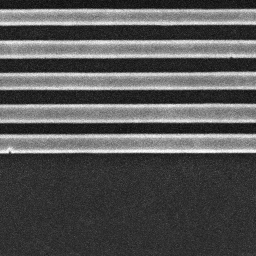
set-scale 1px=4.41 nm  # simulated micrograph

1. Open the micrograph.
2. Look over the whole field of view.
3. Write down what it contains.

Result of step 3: parallel lines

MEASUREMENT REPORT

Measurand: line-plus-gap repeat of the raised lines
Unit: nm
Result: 140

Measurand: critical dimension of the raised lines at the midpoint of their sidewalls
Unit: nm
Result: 65.7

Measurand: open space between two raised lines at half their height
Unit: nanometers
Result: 73.9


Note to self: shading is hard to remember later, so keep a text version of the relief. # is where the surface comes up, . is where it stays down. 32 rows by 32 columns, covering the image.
................................
################################
################################
................................
................................
################################
################################
................................
................................
################################
################################
................................
................................
################################
################################
................................
................................
################################
################################
................................
................................
................................
................................
................................
................................
................................
................................
................................
................................
................................
................................
................................